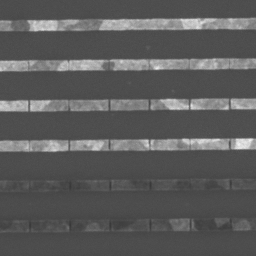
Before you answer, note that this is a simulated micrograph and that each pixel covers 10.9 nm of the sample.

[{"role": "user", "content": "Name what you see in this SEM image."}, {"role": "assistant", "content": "wiring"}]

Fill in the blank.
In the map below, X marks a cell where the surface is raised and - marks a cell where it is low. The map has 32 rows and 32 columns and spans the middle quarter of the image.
XXXXXXXXXXXXXXXXXXXXXXXXXXXXXXXX
--------------------------------
--------------------------------
--------------------------------
--------------------------------
--------------------------------
--------------------------------
--------------------------------
--------------------------------
XXXXXXXXXXXXXXXXXXXXXXXXXXXXXXX-
XXXXXXXXXXXXXXXXXXXXXXXXXXXXXXX-
--------------------------------
--------------------------------
--------------------------------
--------------------------------
--------------------------------
--------------------------------
--------------------------------
--------------------------------
X-XXXXXXXXXXXXXXXXXXXXXXXXXXXXXX
X-XXXXXXXXXXXXXXXXXXXXXXXXXXXXXX
X-XXXXXXXXXXXXXXXXXXXX----------
--------------------------------
--------------------------------
--------------------------------
--------------------------------
--------------------------------
--------------------------------
--------------------------------
X-XXXXXXXXX-XXXXXXXXXXXXXXXXXXXX
X-XXXXXXXXX-XXXXXXXXXXXXXXXXXXXX
X-XXXXXXXXX---------------------